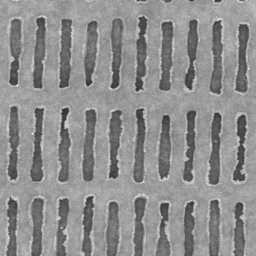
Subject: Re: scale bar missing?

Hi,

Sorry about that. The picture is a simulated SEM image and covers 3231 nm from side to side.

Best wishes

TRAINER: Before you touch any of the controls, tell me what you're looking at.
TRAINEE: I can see a regular array of holes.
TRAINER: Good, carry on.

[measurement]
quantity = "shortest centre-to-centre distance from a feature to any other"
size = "319 nm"